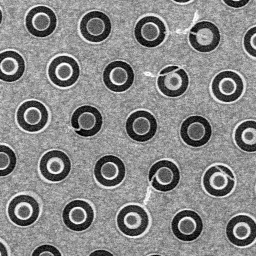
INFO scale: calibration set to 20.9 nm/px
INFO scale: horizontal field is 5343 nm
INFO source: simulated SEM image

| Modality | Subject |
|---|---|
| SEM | an array of small figures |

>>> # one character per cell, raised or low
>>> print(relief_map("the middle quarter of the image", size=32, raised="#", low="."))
#...#######......#########..####
##..######..###..#######......##
##..######..####..######.......#
#...######..####..#####...###..#
...#######..###..######...###..#
..########.......######....##..#
###########.....########.......#
#########################.....##
################################
################################
####...#########################
###......#########...###########
##...##..#######......##########
##..####..######...#...########.
##..####..#####...###..#######..
##..###..######..####..######..#
###......######..####..######..#
###.....########..##...######..#
#################.....#######...
###################.##########..
################################
################################
################################
.########.....##################
..######.......########.....####
..######..###..#######......####
..#####..####..######...##...###
.######..####..######..####..###
########..##...######..####..###
########......########..##...###
#########....#########......####
#######################....#####